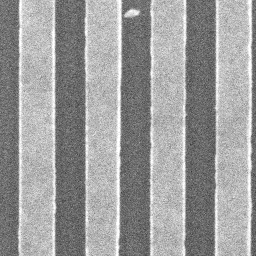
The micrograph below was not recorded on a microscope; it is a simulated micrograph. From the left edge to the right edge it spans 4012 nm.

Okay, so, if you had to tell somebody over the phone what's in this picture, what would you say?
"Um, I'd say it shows lines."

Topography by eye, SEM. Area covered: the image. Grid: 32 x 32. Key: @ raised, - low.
--@@@@@----@@@@----@@@@----@@@@-
--@@@@@----@@@@----@@@@----@@@@-
--@@@@@----@@@@----@@@@----@@@@-
--@@@@@----@@@@----@@@@----@@@@-
--@@@@@----@@@@----@@@@----@@@@-
--@@@@@----@@@@----@@@@----@@@@-
--@@@@@----@@@@----@@@@----@@@@-
--@@@@@----@@@@----@@@@----@@@@-
--@@@@@----@@@@----@@@@----@@@@-
--@@@@@----@@@@----@@@@----@@@@-
--@@@@@----@@@@----@@@@----@@@@-
--@@@@@----@@@@----@@@@----@@@@-
--@@@@@----@@@@----@@@@----@@@@-
--@@@@@----@@@@----@@@@----@@@@-
--@@@@@----@@@@----@@@@----@@@@-
--@@@@@----@@@@----@@@@----@@@@-
--@@@@@----@@@@----@@@@----@@@@-
--@@@@@----@@@@----@@@@----@@@@-
--@@@@@----@@@@----@@@@----@@@@-
--@@@@@----@@@@----@@@@----@@@@-
--@@@@@----@@@@----@@@@----@@@@-
--@@@@@----@@@@----@@@@----@@@@-
--@@@@@----@@@@----@@@@----@@@@-
--@@@@@----@@@@----@@@@----@@@@-
--@@@@@----@@@@----@@@@----@@@@-
--@@@@@----@@@@----@@@@----@@@@-
--@@@@@----@@@@----@@@@----@@@@-
--@@@@@----@@@@----@@@@----@@@@-
--@@@@@----@@@@----@@@@----@@@@-
--@@@@@----@@@@----@@@@----@@@@-
--@@@@@----@@@@----@@@@----@@@@-
--@@@@@----@@@@----@@@@----@@@@-